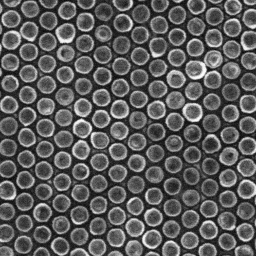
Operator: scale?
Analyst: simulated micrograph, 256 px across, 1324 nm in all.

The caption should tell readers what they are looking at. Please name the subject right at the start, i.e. a regular array of raised bodies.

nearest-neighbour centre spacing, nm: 108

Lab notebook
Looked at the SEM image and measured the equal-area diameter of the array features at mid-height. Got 17.4 pixels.